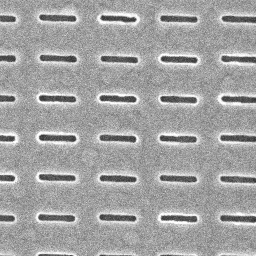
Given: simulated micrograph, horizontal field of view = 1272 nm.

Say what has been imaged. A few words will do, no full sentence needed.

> a regular array of holes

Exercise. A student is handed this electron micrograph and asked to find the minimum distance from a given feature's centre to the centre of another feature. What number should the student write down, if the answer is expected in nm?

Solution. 197